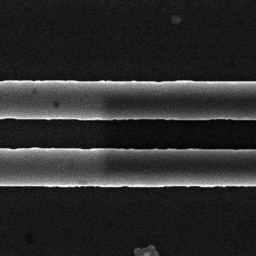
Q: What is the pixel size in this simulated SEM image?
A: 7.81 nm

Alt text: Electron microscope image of lines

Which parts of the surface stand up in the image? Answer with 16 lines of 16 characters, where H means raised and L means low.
LLLLLLLLLLLLLLLL
LLLLLLLLLLLLLLLL
LLLLLLLLLLLLLLLL
LLLLLLLLLLLLLLLL
LLLLLLLLLLLLLLLL
HHHHHHHHHHHHHHHH
HHHHHHHHHHHHHHHH
LLLLLLLLLLLLLLLL
LLLLLLLLLLLLLLLL
HHHHHHHHHHHHHHHH
HHHHHHHHHHHHHHHH
HHHHHHHHHHHHHHHH
LLLLLLLLLLLLLLLL
LLLLLLLLLLLLLLLL
LLLLLLLLLLLLLLLL
LLLLLLLLLLLLLLLL